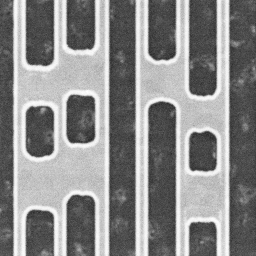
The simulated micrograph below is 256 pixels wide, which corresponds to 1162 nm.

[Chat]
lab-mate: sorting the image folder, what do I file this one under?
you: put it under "parallel lines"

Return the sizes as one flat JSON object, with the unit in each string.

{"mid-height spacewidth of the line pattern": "0.142 micrometres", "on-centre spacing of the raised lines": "185 nanometres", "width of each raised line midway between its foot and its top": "39.2 nanometres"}